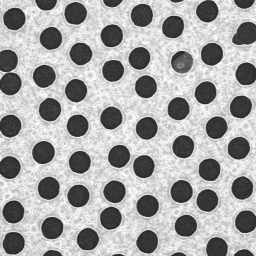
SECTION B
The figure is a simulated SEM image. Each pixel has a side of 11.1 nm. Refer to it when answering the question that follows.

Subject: a regular array of holes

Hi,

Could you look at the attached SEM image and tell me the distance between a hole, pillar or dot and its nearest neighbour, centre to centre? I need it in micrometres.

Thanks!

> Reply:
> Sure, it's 0.352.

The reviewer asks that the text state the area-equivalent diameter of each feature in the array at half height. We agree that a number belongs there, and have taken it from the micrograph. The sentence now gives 250 nm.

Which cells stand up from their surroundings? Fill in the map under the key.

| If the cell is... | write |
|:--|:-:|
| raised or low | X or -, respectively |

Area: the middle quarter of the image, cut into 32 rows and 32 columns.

XXXXXXXXXX-----XX----XXXXXX-----
XXXXXXXXXX-----XXXXXXXXXXXXX---X
XXXXXXXXXX-----XXXXXXXXXXXXXXXXX
XXXXXXXXXX----XXXXX---XXXXXXXXXX
X----XXXXXXX-XXXXX-----XXXXXXXXX
-----XXXXXXXXXXXXX-----XXXXXXXXX
------XXXXXXXXXXXX-----XXXXXXXXX
------XXXXXXXXXXXX-----XXXXXXXXX
X----XXXXXXXXXXXXXXX-XXXXXXX--XX
XX--XXXXXXXXXXXXXXXXXXXXXX-----X
XXXXXXXXXXXXXXXXXXXXXXXXXX-----X
XXXXXXXXXX----XXXXXXXXXXXX-----X
XXXXXXXXX-----XXXXXXXXXXXX-----X
X----XXXX------XXXXX--XXXXX---XX
X-----XXX-----XXXX-----XXXXXXXXX
X-----XXXX----XXXX-----XXXXXXXXX
X-----XXXXXXXXXXXX-----XXXXXXXXX
X----XXXXXXXXXXXXX-----XXXXXXXXX
XXXXXXXXXXXXXXXXXXX---XXXXXX----
XXXXXXXXXXXXXXXXXXXXXXXXXXX-----
XXXXXXXXXXXXX--XXXXXXXXXXXX-----
XXXXXXXXXXXX----XXXXXXXXXXX-----
XX----XXXXX------XXXXXXXXXXX----
X------XXXX------X----XXXXXXX--X
X------XXXX-----X-----XXXXXXXXXX
X------XXXXX---XX------XXXXXXXXX
XX----XXXXXXXXXXX-----XXXXXXXXXX
XXXXXXXXXXXXXXXXXX----XXXXXXXXXX
XXXXXXXXXXXXXXXXXXXX-XXXXXXXXXXX
XXXXXXXXXXX---XXXXXXXXXXXXXX---X
XX---XXXXX-----XXXXXXXXXXXX-----
X-----XXXX-----XXXXXXXXXXXX-----